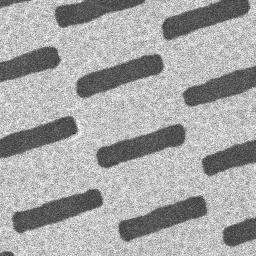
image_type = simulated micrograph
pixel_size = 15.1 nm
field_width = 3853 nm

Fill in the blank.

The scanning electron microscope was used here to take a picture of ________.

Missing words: holes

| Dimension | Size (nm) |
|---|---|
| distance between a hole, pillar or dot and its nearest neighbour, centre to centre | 1130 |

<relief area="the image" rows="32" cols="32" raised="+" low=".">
..+++++++.........++++++++.....+
+++++++.......+++++++++........+
+++++++.....+++++++++........+++
++++++++++++++++++++.....+++++++
++++++++++++++++++++...+++++++++
++++++++++++++++++++++++++++++++
++++...+++++++++++++++++++++++++
+.......++++++++....++++++++++++
.......++++++.......+++++++++++.
...+++++++.........+++++++++....
++++++++++......+++++++++.......
++++++++++...++++++++++........+
+++++++++++++++++++++++....+++++
++++++++++++++++++++++++++++++++
++++++++++++++++++++++++++++++++
++++++....++++++++++++++++++++++
++........+++++++++....+++++++++
........+++++++........+++++++++
.....++++++++........++++++++...
..++++++++++......++++++++......
++++++++++++...++++++++++......+
++++++++++++++++++++++++++..++++
++++++++++++++++++++++++++++++++
++++++++++++++++++++++++++++++++
+++++++++....+++++++++++++++++++
+++++........++++++++.....++++++
++........+++++++++.......++++++
++......++++++++........+++++++.
++...++++++++++......+++++++....
+++++++++++++++...++++++++++....
++++++++++++++++++++++++++++..++
.+++++++++++++++++++++++++++++++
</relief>